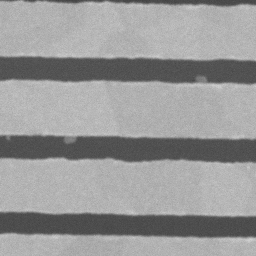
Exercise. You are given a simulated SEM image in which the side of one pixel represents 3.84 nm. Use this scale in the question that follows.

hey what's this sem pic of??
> lines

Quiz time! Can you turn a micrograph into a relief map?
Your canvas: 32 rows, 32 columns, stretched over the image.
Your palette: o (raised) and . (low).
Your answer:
ooooooooooooooooo...............
oooooooooooooooooooooooooooooooo
oooooooooooooooooooooooooooooooo
oooooooooooooooooooooooooooooooo
oooooooooooooooooooooooooooooooo
oooooooooooooooooooooooooooooooo
oooooooooooooooooooooooooooooooo
...............................o
................................
................................
ooooooooooooooooooooooooooo.oo..
oooooooooooooooooooooooooooooooo
oooooooooooooooooooooooooooooooo
oooooooooooooooooooooooooooooooo
oooooooooooooooooooooooooooooooo
oooooooooooooooooooooooooooooooo
oooooooooooooooooooooooooooooooo
................................
................................
................................
oooooooooooooooooooooooooooooooo
oooooooooooooooooooooooooooooooo
oooooooooooooooooooooooooooooooo
oooooooooooooooooooooooooooooooo
oooooooooooooooooooooooooooooooo
oooooooooooooooooooooooooooooooo
o.oooooooooooooooooooooooooooooo
................................
................................
ooooooooooooooo.o...............
oooooooooooooooooooooooooooooooo
oooooooooooooooooooooooooooooooo